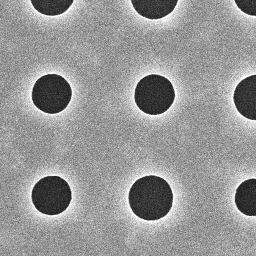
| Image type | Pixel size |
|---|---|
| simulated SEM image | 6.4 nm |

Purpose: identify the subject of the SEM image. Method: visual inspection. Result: holes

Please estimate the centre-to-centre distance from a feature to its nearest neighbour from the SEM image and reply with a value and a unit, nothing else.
642 nm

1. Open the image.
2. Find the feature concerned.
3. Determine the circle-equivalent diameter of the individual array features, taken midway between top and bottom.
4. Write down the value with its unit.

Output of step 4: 260 nm